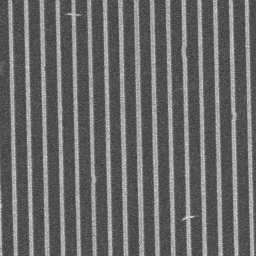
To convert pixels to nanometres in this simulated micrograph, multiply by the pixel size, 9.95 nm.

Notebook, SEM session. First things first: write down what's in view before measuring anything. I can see parallel lines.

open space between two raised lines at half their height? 128 nm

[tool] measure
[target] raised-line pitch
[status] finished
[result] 157 nm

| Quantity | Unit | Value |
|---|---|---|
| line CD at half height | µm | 0.0273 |